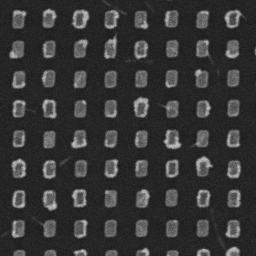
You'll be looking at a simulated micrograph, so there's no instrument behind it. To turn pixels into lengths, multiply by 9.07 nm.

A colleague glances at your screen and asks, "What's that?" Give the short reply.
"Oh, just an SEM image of a regular array of raised bodies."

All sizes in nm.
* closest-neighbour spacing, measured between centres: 269